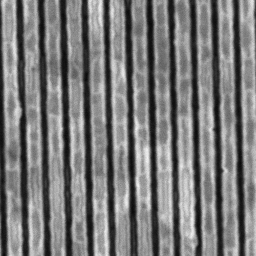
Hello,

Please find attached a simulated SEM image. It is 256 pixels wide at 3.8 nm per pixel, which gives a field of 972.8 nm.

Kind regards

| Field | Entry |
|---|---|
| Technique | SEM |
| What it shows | parallel lines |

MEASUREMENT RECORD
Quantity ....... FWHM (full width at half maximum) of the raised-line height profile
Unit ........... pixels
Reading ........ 13.6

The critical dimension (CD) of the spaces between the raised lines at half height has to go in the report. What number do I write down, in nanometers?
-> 29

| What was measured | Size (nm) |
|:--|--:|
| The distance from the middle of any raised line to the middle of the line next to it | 82.1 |